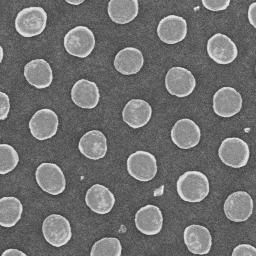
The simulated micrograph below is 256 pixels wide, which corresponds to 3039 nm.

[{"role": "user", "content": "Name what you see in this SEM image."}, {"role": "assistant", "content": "a regular array of raised bodies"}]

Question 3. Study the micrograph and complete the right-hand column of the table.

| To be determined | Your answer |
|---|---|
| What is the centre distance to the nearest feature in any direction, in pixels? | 51.7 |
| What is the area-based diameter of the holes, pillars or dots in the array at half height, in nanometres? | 337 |